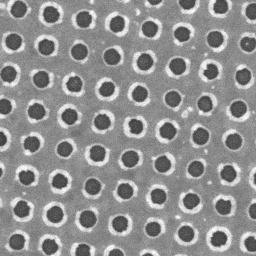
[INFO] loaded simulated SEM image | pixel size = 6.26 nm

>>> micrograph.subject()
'a regular array of holes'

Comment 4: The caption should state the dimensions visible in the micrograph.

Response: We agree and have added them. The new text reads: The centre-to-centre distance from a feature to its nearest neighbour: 204 nanometers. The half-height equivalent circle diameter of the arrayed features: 107 nm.